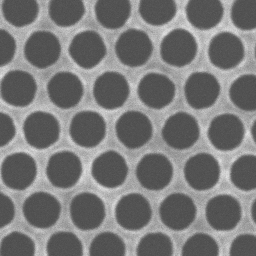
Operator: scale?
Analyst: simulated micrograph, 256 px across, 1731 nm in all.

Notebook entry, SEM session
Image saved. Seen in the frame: a regular array of holes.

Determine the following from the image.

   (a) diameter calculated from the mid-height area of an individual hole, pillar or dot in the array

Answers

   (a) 255 nanometers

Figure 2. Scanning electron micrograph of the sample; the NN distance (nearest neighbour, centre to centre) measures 0.304 um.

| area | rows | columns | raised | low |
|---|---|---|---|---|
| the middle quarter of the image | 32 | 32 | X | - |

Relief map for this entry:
XXXX----XXXXXXXX---XXXXXXXXX---X
XXXXXXXXXXXXXXXXXXXXXXXXXXXXXXXX
---XXXXXX-----XXXXXXX---XXXXXXXX
----XXXX-------XXXXX------XXXXX-
----XXXX--------XXX--------XXX--
-----XX---------XX----------XX--
-----XX----------X----------XX--
-----XX----------X----------XX--
----XXX---------XXX---------XX--
----XXXX-------XXXX--------XXXX-
---XXXXXX------XXXXXX-----XXXXX-
XXXXXXXXXXX-XXXXXXXXXXX-XXXXXXXX
XXX------XXXXXX-----XXXXXXX-----
XX--------XXXX-------XXXXX------
XX---------XX---------XXX-------
X----------XX---------XXX-------
X----------XX---------XX--------
X----------XX---------XX--------
XX--------XXX---------XXX-------
XX-------XXXXX-------XXXX-------
XXXX----XXXXXXX-----XXXXXX------
XXXXXXXXXXX-XXXXXXXXXXXXXXXX---X
---XXXXXXX----XXXXXXX----XXXXXXX
----XXXX-------XXXXX------XXXXX-
----XXX--------XXXX-------XXXX--
----XXX---------XX---------XXX--
-----XX---------XX---------XXX--
----XXX---------XX---------XXX--
----XXX---------XX---------XXX--
---XXXXX-------XXXX--------XXXX-
--XXXXXXXX----XXXXX-------XXXXX-
XXXXXXXXXXXXXXXXXXXXX----XXXXXXX